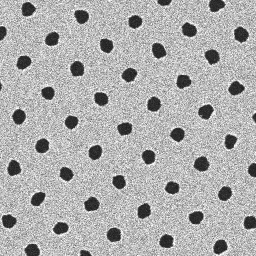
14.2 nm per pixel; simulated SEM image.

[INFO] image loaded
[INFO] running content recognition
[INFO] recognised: a regular array of holes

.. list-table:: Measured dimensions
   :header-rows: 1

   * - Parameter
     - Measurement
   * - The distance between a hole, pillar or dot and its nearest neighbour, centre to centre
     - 521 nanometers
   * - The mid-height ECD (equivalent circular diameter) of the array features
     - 203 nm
